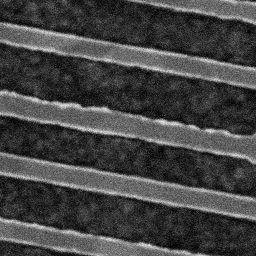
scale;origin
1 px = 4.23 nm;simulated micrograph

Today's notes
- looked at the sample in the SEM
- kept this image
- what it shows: one or a few lines or trenches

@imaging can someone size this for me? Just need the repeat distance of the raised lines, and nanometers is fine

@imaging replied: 273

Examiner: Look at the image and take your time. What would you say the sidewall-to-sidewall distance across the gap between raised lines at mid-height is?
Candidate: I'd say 0.19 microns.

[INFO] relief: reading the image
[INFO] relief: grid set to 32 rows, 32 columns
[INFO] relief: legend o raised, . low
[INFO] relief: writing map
...................ooooooooooooo
.........................ooooooo
..............................oo
ooo.............................
ooooooooo.......................
.ooooooooooooo..................
.......ooooooooooooo............
.............ooooooooooooo......
..................oooooooooooooo
........................oooooooo
.............................ooo
o...............................
ooooo...........................
oooooooooo.o....................
..ooooooooooooooo...............
.......ooooooooooooooo..........
.............ooooooooooooooo....
..................oooooooooooooo
.......................ooooooooo
oo............................oo
ooooooo.........................
ooooooooooooo...................
.....oooooooooooooo.............
..........oooooooooooooo........
................ooooooooooooo...
.....................ooooooooooo
...........................ooooo
o...............................
oooooo..........................
oooooooooooo....................
....ooooooooooooo...............
..........ooooooooooooo.........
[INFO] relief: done